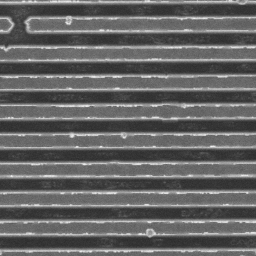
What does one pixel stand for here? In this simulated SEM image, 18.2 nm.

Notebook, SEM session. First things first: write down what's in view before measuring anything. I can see parallel lines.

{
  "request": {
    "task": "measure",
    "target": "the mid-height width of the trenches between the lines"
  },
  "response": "251 nm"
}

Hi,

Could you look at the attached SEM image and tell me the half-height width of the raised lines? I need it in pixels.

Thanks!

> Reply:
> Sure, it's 15.4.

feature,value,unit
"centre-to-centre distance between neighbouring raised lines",530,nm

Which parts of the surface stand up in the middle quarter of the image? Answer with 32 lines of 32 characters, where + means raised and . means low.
................................
................................
................................
++++++++++++++++++++++++++++++++
++++++++++++++++++++++++++++++++
++++++++++++++++++++++++++++++++
+++++...........................
................................
................................
................................
++++++++++++++++++++++++++++++++
++++++++++++++++++++++++++++++++
++++++++++++++++++++++++++++++++
++++++++++++++++++++++++++++++++
................................
................................
................................
++++++++++++++++++++++++++++++++
++++++++++++++++++++++++++++++++
++++++++++++++++++++++++++++++++
++++++++++++++++++++++++++++++++
................................
................................
................................
............++..................
++++++++++++++++++++++++++++++++
++++++++++++++++++++++++++++++++
++++++++++++++++++++++++++++++++
................................
................................
................................
................................